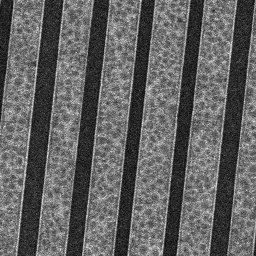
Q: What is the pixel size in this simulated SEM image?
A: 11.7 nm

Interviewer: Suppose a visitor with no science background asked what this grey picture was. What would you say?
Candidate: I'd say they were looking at parallel lines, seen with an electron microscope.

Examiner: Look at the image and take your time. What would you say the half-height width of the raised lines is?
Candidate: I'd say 362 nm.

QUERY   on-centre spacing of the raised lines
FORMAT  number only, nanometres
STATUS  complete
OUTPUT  554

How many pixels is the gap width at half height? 17.3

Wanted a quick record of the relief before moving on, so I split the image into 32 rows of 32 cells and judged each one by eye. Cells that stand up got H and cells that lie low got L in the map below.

LLHHHLLLHHHHLLHHHHLHHHHHLLHHHLLL
LLHHHLLLHHHLLLHHHLLHHHHHLLHHHLLL
LLHHHLLLHHHLLLHHHLLHHHHLLHHHHLLL
LHHHHLLLHHHLLHHHHLLHHHHLLHHHHLLH
LHHHHLLLHHHLLHHHHLLHHHHLLHHHHLLH
LHHHHLLHHHHLLHHHHLLHHHHLLHHHHLLH
LHHHHLLHHHHLLHHHHLLHHHHLLHHHHLLH
LHHHHLLHHHHLLHHHHLLHHHHLLHHHHLLH
LHHHHLLHHHHLLHHHHLLHHHHLLHHHHLLH
LHHHLLLHHHHLLHHHHLHHHHHLLHHHHLLH
LHHHLLLHHHLLLHHHLLHHHHHLLHHHLLLH
HHHHLLLHHHLLLHHHLLHHHHLLHHHHLLLH
HHHHLLLHHHLLHHHHLLHHHHLLHHHHLLLH
HHHHLLLHHHLLHHHHLLHHHHLLHHHHLLLH
HHHHLLHHHHLLHHHHLLHHHHLLHHHHLLHH
HHHHLLHHHHLLHHHHLLHHHHLLHHHHLLHH
HHHHLLHHHHLLHHHHLLHHHHLLHHHHLLHH
HHHHLLHHHHLLHHHHLLHHHHLLHHHHLLHH
HHHLLLHHHHLLHHHHLHHHHHLLHHHHLLHH
HHHLLLHHHLLLHHHHLHHHHHLHHHHLLLHH
HHHLLLHHHLLLHHHLLHHHHLLHHHHLLLHH
HHHLLLHHHLLHHHHLLHHHHLLHHHHLLLHH
HHHLLLHHHLLHHHHLLHHHHLLHHHHLLHHH
HHHLLHHHHLLHHHHLLHHHHLLHHHHLLHHH
HHHLLHHHHLLHHHHLLHHHHLLHHHHLLHHH
HHHLLHHHHLLHHHHLLHHHHLLHHHHLLHHH
HHHLLHHHHLLHHHHLLHHHHLLHHHHLLHHH
HHHLLHHHHLLHHHHLLHHHHLLHHHHLLHHH
HHLLLHHHLLLHHHHLHHHHHLHHHHLLLHHH
HHLLLHHHLLLHHHLLHHHHLLHHHHLLLHHH
HHLLLHHHLLHHHHLLHHHHLLHHHHLLLHHH
HHLLLHHHLLHHHHLLHHHHLLHHHHLLLHHH